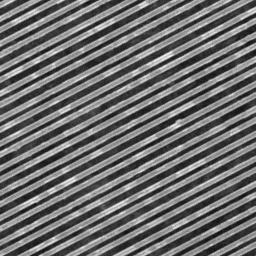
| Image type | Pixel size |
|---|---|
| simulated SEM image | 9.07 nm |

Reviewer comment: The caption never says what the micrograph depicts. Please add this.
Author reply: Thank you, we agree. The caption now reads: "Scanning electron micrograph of parallel lines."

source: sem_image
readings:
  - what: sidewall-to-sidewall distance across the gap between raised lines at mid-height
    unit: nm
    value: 51.7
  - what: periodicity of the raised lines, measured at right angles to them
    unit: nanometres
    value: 99.9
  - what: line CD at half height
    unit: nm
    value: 42.2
